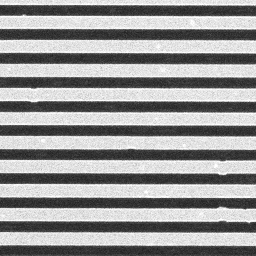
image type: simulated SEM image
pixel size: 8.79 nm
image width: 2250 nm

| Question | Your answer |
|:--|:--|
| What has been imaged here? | parallel lines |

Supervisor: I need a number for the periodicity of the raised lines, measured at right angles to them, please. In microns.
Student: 0.211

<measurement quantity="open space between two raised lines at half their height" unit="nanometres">83.5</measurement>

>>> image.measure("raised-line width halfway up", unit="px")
14.2